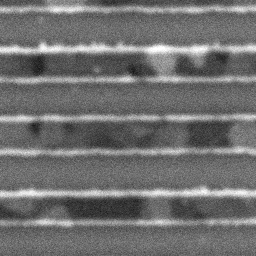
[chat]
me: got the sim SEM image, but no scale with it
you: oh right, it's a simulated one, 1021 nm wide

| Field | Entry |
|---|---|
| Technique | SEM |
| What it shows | lines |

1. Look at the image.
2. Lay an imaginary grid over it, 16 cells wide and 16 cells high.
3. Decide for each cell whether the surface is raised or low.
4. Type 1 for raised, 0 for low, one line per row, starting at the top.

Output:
1111111111111111
0000000000000000
0000000000000000
1111111111111111
1111111111111111
0000000000000000
0000000000000000
1111111111111111
1111111111111111
1111111111100000
0000000000000000
0000000000000000
1111111111111111
1111111111111111
0000000000000000
0000000000000000